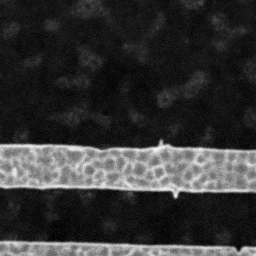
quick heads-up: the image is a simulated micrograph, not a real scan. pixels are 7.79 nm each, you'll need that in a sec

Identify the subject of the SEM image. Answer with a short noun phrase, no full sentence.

one or a few lines or trenches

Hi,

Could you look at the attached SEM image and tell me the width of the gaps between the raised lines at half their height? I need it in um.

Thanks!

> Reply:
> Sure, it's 0.435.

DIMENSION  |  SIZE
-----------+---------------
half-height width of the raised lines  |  320 nanometres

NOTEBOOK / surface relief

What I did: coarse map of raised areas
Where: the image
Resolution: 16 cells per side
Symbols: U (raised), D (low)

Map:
DDDDDDDDDDDDDDDD
DDDDDDDDDDDDDDDD
DDDDDDDDDDDDDDDD
DDDDDDDDDDDDDDDD
DDDDDDDDDDDDDDDD
DDDDDDDDDDDDDDDD
DDDDDDDDDDDDDDDD
DDDDDDDDDDDDDDDD
DDDDDDDDDDDDDDDD
UUUUUUUUUUUUUUUU
UUUUUUUUUUUUUUUU
UUUUUUUUUUUUUUUU
DDDDDDDDDDDDDDDD
DDDDDDDDDDDDDDDD
DDDDDDDDDDDDDDDD
UUUUUUUUUUUUUUDU